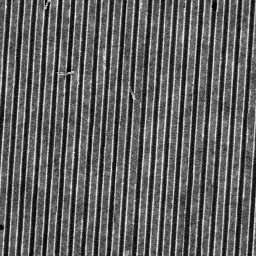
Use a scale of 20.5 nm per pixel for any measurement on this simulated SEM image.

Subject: parallel lines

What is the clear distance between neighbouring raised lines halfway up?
0.102 micrometres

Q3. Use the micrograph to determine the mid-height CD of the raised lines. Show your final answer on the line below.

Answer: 163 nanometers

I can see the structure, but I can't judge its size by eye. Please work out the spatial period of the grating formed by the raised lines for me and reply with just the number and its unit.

262 nm